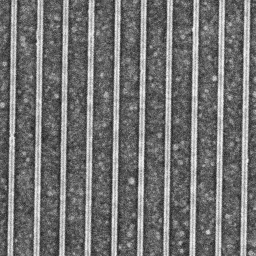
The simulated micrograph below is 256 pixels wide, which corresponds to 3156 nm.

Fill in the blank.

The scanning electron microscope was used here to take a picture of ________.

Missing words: parallel lines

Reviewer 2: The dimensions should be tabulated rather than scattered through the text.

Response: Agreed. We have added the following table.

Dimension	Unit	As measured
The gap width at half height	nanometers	276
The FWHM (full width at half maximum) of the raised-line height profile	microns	0.0432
